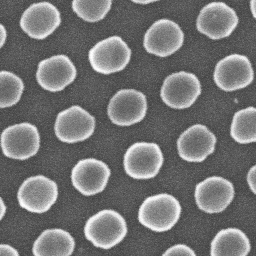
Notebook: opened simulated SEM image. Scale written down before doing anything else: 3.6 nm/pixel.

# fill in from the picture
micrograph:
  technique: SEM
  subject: a regular array of raised bodies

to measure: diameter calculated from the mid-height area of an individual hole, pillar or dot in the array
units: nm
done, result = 130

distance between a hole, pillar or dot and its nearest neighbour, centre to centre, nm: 197